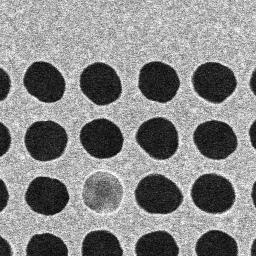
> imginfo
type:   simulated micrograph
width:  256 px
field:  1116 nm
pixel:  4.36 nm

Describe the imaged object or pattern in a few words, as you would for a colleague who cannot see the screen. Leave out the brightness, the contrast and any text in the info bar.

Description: a regular array of holes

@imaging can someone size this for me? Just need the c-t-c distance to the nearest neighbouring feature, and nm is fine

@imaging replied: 242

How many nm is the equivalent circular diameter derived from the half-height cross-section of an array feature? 183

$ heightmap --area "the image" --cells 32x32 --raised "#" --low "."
################################
################################
################################
################################
################################
################################
################################
################################
###....####...####....###....###
.##.....##.....##.....##.....##.
.##.....##.....##.....##......#.
.##.....##.....###....###....###
#####..####...#####..#####..####
################################
################################
####...####...####....###...####
.##.....##.....##.....##.....##.
.##.....##.....##.....##......#.
.##.....##.....###....###.....##
####...#####..#####...###....###
################################
################################
####...###########...###....####
.##.....#########.....##.....##.
.##......########......#.....##.
.##.....#########......#.....###
####....##########....####..####
################################
################################
####...####...####...####....###
.##.....##.....##.....##......##
.##......#.....##.....##......#.